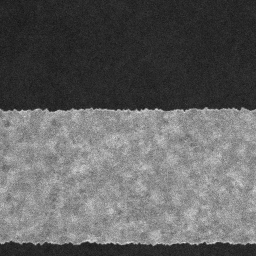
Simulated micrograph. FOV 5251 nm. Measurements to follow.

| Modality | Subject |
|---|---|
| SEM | one or a few lines or trenches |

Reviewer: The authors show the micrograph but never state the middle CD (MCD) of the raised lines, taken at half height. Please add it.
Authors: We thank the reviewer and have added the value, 2530 nm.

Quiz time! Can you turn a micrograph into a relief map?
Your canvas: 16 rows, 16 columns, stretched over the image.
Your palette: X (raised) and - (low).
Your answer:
----------------
----------------
----------------
----------------
----------------
----------------
----------------
XXXXXXXXXXXXXXXX
XXXXXXXXXXXXXXXX
XXXXXXXXXXXXXXXX
XXXXXXXXXXXXXXXX
XXXXXXXXXXXXXXXX
XXXXXXXXXXXXXXXX
XXXXXXXXXXXXXXXX
XXXXXXXXXXXXXXXX
----------------